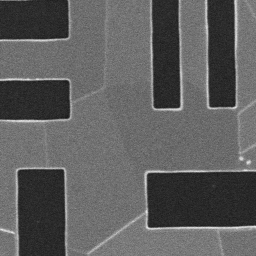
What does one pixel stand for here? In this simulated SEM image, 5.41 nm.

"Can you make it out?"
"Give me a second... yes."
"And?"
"groups of lines, slits or small figures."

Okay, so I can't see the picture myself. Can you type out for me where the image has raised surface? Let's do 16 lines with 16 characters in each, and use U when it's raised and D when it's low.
DDDDUUUUUDDUUDDU
DDDDUUUUUDDUUDDU
DDDUUUUUUDDUUDDU
UUUUUUUUUDDUUDDU
UUUUUUUUUUDUUDDU
DDDDUUUUUUDUUDDU
DDDDUUUUUUDUUDDU
DDDDUUUUUUUUUUUU
UUUUUUUUUUUUUUUU
UUUUUUUUUUUUUUUU
UUUUUUUUUUUUUUUU
UDDDUUUUUDDDDDDD
UDDDUUUUUDDDDDDD
UDDDUUUUUDDDDDDD
UDDDUUUUUUUUUUUU
UDDDUUUUUUUUUUUU